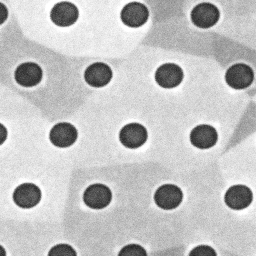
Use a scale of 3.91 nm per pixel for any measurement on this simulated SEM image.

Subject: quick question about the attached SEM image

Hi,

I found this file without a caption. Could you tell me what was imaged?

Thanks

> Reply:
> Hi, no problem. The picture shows a regular array of holes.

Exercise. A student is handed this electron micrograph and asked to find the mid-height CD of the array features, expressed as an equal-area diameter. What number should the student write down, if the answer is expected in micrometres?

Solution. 0.111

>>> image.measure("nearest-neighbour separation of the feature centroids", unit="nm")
273